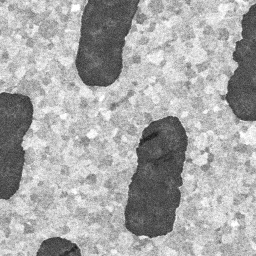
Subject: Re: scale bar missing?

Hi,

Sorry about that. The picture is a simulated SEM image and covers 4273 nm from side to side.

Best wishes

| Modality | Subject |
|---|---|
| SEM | holes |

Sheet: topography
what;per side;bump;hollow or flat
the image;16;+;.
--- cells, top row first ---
+++++....+++++++
+++++...+++++++.
+++++...+++++++.
+++++...+++++++.
+++++...+++++++.
++++++++++++++..
..++++++++++++..
..++++++++.++++.
..+++++++...++++
..+++++++...++++
.+++++++...+++++
.+++++++...+++++
++++++++...+++++
++++++++...+++++
++++++++...+++++
++...+++++++++++